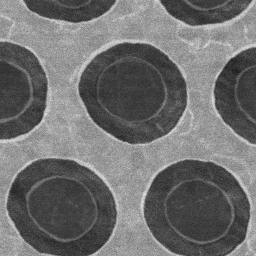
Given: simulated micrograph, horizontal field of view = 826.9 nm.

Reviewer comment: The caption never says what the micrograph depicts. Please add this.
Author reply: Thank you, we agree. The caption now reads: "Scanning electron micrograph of ring-shaped grooves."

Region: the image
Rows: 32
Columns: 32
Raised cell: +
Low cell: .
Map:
+++....++++...++++++....++++...+
++++.........++++++++..........+
++++++++....++++++++++.......+++
++++++++++++++++++++++++++++++++
++++++++++++++++++++++++++++++++
..++++++++++++.....+++++++++++++
....++++++++........++++++++++..
.....++++++....+++...++++++++...
+++..+++++...++++++...++++++...+
++++..++++..++++++++...++++...++
++++..++++..+++++++++..++++..+++
++++..++++..+++++++++..++++..+++
++++..++++..+++++++++...+++...++
+++...+++++..+++++++...++++...++
++...++++++...+++++....++++....+
.....+++++++..........++++++....
....+++++++++........++++++++...
..+++++++++++++.....+++++++++++.
++++++++++++++++++++++++++++++++
++++++++++++++++++++++++++++++++
++++......+++++++++++......+++++
++..........++++++++.........+++
++....++++...++++++.....+.....++
+...+++++++...++++....+++++...++
+..++++++++...++++...+++++++...+
+..+++++++++...+++...++++++++..+
+...++++++++...+++...++++++++..+
+...++++++++...+++...++++++++..+
++...++++++...+++++...+++++++..+
+++....+++....+++++....+++++...+
++++.........+++++++..........++
+++++.......+++++++++........+++